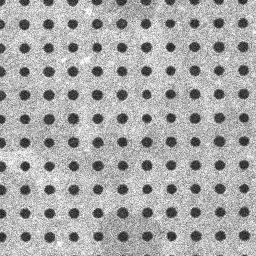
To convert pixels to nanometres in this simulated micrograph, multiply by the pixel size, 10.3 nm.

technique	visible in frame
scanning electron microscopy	a regular array of holes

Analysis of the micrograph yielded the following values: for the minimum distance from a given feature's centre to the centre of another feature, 23.5 pixels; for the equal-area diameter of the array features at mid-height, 116 nm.